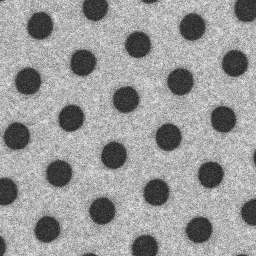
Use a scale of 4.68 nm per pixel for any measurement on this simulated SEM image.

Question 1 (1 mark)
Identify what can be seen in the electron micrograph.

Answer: a regular array of holes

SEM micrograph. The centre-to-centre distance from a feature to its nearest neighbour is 263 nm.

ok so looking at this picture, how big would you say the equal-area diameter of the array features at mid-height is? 27.2 px